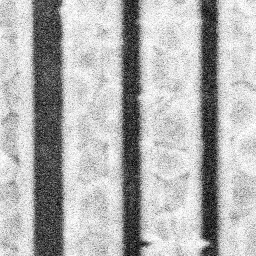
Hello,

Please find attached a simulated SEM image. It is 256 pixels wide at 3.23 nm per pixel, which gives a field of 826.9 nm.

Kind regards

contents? one or a few lines or trenches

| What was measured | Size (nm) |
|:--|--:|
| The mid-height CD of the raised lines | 164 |